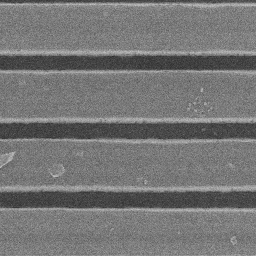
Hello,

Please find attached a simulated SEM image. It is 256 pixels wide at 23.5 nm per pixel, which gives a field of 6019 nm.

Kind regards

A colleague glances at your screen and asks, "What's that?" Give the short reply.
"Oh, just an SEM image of lines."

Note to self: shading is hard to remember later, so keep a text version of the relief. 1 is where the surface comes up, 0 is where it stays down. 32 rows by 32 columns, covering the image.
00000000000000000000000000000000
11111111111111111111111111111111
11111111111111111111111111111111
11111111111111111111111111111111
11111111111111111111111111111111
11111111111111111111111111111111
11111111111111111111111111111111
00000000000000000000000000000000
00000000000000000000000000000000
11111111111111111111111111111111
11111111111111111111111111111111
11111111111111111111111111111111
11111111111111111111111111111111
11111111111111111111111111111111
11111111111111111111111111111111
00000000000000000000000000000000
00000000000000000000000000000000
11111111111010000000000000011110
11111111111111111111111111111111
11111111111111111111111111111111
11111111111111111111111111111111
11111111111111111111111111111111
11111111111111111111111111111111
11111111111111111111111111111111
00000000000000000000000000000000
00000000000000000000000000000000
11111111111111111111111111111111
11111111111111111111111111111111
11111111111111111111111111111111
11111111111111111111111111111111
11111111111111111111111111111111
11111111111111111111111111111111